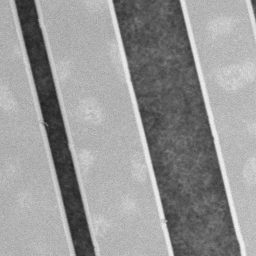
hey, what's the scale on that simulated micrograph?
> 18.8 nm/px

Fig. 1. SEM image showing one or a few lines or trenches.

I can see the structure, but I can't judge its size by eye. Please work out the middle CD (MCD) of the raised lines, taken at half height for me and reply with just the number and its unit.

1350 nanometers